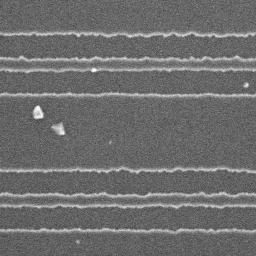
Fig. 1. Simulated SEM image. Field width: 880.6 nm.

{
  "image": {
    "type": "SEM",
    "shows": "lines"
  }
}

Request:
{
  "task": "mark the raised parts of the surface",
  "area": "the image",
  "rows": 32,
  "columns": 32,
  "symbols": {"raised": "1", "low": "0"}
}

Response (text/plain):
11111111111111111111111111111111
11111111111111111111111111111111
11111111111111111111111111111111
11111111111111111111111111111111
00000000000001001010000000010110
00000000000000000000000000000000
00000000000000000000000000000000
11111111111111111111111111111111
11111111111111111111111111111111
00000000000000000000000000000000
00000000000000000000000000000000
00000000000000000000000000000000
11111111111111111111111111111111
11111111111111111111111111111111
11111111111111111111111111111111
11111111111111111111111111111111
11111111111111111111111111111111
11111111111111111111111111111111
11111111111111111111111111111111
11111111111111111111111111111111
11111111111111111111111111111111
00000000000000000000000000000001
00000000000000000000000000000000
00000000000000000000000000000000
11111111111111111111111111111111
11111111111111111111111111111111
00000000000000000000000000000000
00000000000000000000000000000000
00000000000000000000000000000000
11111111111111111111111111111111
11111111111111111111111111111111
11111111111111111111111111111111